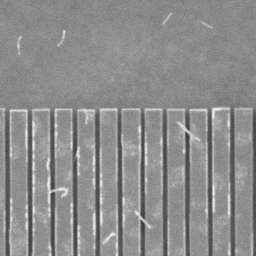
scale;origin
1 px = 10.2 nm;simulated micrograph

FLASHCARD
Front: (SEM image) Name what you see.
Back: parallel lines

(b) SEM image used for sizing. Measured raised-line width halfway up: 176 nanometers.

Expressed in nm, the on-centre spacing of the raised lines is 229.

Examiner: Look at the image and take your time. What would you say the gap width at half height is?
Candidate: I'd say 5.12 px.